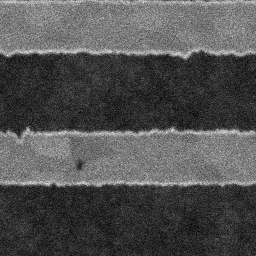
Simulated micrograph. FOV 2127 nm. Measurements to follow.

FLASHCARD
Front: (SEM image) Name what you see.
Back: one or a few lines or trenches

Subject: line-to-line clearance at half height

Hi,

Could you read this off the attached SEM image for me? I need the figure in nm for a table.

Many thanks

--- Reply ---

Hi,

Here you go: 619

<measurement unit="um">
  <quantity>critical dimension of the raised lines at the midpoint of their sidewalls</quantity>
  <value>0.432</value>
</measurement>